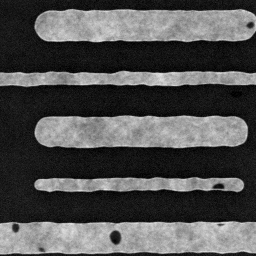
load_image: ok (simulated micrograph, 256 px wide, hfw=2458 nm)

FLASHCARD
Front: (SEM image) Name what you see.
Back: groups of lines, slits or small figures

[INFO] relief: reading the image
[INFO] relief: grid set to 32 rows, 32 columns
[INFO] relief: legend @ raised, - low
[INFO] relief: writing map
--------------------------------
------@@@@@@@@@@@@@@@@@@@@@@@@@-
-----@@@@@@@@@@@@@@@@@@@@@@@@@@@
----@@@@@@@@@@@@@@@@@@@@@@@@@@@@
-----@@@@@@@@@@@@@@@@@@@@@@@@@@-
--------------------------------
--------------------------------
--------------------------------
--------------------------------
@@@@@@@@@@@@@@@@@@@@@@@@@@@@@@@@
@@@@@@@@@@@@@@@@@@@@@@@@@--@@@@@
--------------------------------
--------------------------------
--------------------------------
--------------------------------
-----@@@@@@@@@@@@@@@@@@@@@@@@@@-
----@@@@@@@@@@@@@@@@@@@@@@@@@@@-
-----@@@@@@@@@@@@@@@@@@@@@@@@@@-
--------------------------------
--------------------------------
--------------------------------
--------------------------------
-----@@@@@-@@@@@@@@@@@@@@@@@@@--
-----@@@@@@@@@@@@@@@@@@@@@@@@@--
--------------------------------
--------------------------------
--------------------------------
--------------------------------
@@@@@@@@@@@@@@@@@@@@@@@@@@@@@@@@
@@@@@@@@@@@@@@@@@@@@@@@@@@@@@@@@
@@@@@@@@@@@@@@@@@@@@@@@@@@@@@@@@
@@@@@@@@@@@@@@@@@@@@@@@-@@@@@@@@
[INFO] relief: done